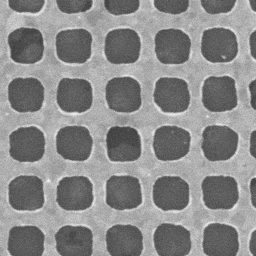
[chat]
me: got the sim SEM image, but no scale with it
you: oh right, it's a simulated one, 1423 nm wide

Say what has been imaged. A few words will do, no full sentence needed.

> a regular array of holes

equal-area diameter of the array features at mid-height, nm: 214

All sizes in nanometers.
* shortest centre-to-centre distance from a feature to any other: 266